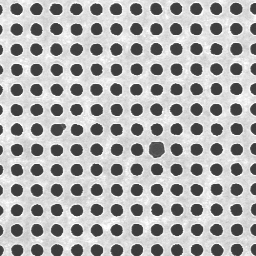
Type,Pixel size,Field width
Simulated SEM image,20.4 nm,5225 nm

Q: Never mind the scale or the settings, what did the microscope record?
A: a regular array of holes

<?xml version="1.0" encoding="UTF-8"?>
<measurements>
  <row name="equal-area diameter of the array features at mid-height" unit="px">12.6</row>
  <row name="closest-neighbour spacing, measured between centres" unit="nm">404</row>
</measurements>